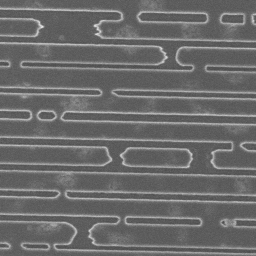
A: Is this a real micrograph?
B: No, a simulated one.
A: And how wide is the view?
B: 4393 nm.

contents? parallel lines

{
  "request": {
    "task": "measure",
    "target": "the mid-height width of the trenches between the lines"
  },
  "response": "109 nm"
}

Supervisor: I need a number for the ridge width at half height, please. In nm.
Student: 326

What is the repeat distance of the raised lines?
25.7 px